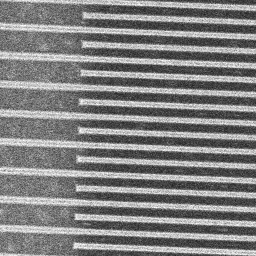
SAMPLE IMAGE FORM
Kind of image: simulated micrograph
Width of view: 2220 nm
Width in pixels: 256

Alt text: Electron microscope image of parallel lines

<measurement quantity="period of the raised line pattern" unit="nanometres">125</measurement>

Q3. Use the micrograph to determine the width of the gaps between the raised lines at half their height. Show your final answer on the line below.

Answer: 70.4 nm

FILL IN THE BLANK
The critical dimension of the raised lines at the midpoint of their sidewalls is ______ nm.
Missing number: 52